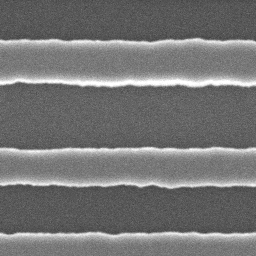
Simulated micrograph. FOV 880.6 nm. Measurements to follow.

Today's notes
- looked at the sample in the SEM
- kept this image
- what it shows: lines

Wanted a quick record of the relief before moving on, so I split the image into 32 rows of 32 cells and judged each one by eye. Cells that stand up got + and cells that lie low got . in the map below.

................................
................................
................................
................................
................................
++++++++++++++++++++++++++++++++
++++++++++++++++++++++++++++++++
++++++++++++++++++++++++++++++++
++++++++++++++++++++++++++++++++
++++++++++++++++++++++++++++++++
............++................++
................................
................................
................................
................................
................................
................................
................................
..................+.......++....
++++++++++++++++++++++++++++++++
++++++++++++++++++++++++++++++++
++++++++++++++++++++++++++++++++
++++++++++++++++++++++++++++++++
................................
................................
................................
................................
................................
................................
++++++++++++++++++++++++++++++++
++++++++++++++++++++++++++++++++
++++++++++++++++++++++++++++++++